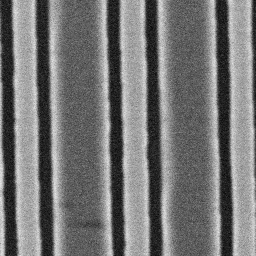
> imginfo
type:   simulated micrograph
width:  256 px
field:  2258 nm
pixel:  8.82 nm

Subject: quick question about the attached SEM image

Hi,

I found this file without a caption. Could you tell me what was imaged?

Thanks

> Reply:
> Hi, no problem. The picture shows lines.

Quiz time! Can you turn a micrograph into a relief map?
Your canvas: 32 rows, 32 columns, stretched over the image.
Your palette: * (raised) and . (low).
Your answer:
..**..*******..***..*******..**.
..**..*******..***..*******..**.
..**..*******..***..*******..**.
..**..*******..***..*******..**.
..**..*******..***..*******..**.
..**..*******..***..*******..**.
..**..*******..***..*******..**.
..**..*******..***..*******..**.
..**..*******..***..*******..**.
..**..*******..***..*******..**.
..**..*******..***..*******..**.
..***.*******..***..*******..**.
..***.********.***..*******..**.
..***..*******.***..*******..***
..***..*******.***..*******..***
..***..*******.***..*******..***
..***..*******.***..*******..***
..***..*******..**..*******..***
..***..*******..**..*******..***
..***..*******..**..*******..***
..***..*******..**..*******..***
..***..*******..**..*******..***
..***..*******..**..*******..***
..***..*******..**..*******..***
..***..*******..**..*******..***
..***..*******..**..*******..***
..***..*******..**..*******..***
..***..*******..***.*******..***
..***..*******..***.*******..***
..***..*******..***..******..***
..***..*******..***..******..***
..***..*******..***..******..***